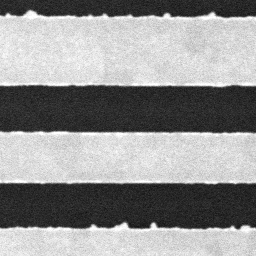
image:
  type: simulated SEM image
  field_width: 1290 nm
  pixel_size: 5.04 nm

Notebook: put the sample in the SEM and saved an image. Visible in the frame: lines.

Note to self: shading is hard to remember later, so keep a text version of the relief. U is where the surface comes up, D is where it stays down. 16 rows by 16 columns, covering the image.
DDDDDDDDDDDDDDDD
UUUUUUUUUUUUUUUU
UUUUUUUUUUUUUUUU
UUUUUUUUUUUUUUUU
UUUUUUUUUUUUUUUU
DDDDDDDDDDDDDDDD
DDDDDDDDDDDDDDDD
DDDDDDDDDDDDDDDD
UUUUUUUUUUUUUUUU
UUUUUUUUUUUUUUUU
UUUUUUUUUUUUUUUU
DDDDDDDDDDDDDDDD
DDDDDDDDDDDDDDDD
DDDDDDDDDDDDDDDD
UUUUUUUUUUUUUUUU
UUUUUUUUUUUUUUUU